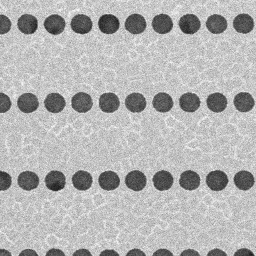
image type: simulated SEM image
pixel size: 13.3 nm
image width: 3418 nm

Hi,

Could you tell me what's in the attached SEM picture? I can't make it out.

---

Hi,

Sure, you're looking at a regular array of holes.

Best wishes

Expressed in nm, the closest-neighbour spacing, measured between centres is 359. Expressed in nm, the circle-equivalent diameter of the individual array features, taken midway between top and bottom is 290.